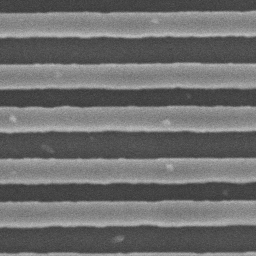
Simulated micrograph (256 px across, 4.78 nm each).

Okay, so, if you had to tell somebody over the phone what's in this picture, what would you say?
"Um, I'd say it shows lines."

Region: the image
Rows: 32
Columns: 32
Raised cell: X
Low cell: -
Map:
--------------------------------
-------------------------------X
XXXXXXXXXXXXXXXXXXXXXXXXXXXXXXXX
XXXXXXXXXXXXXXXXXXXXXXXXXXXXXXXX
X-X----X--XX--XXXX--------------
--------------------------------
--------------------------------
--------------------------------
XXXXXXXXXXXXXXXXXXXXXXXXXXXXXXXX
XXXXXXXXXXXXXXXXXXXXXXXXXXXXXXXX
XXXXXXXXXXXXXXXXXXXXXXXXXXXXXXXX
--------------------------------
--------------------------------
XXXXXX-XXXXXXXXXXXXXXXXXXXXXXXXX
XXXXXXXXXXXXXXXXXXXXXXXXXXXXXXXX
XXXXXXXXXXXXXXXXXXXXXXXXXXXXXXXX
XX------------------------------
--------------------------------
--------------------------------
--------------------------------
XXXXXXXXXXXXXXXXXXXXXXXXXXXXXXXX
XXXXXXXXXXXXXXXXXXXXXXXXXXXXXXXX
XXXXXXXXXXXXXXXXXXXXXXXXXXXXXXXX
--------------------------------
--------------------------------
XXXXXXXXXXXXXXXXXXXXXXXXXXXXXXXX
XXXXXXXXXXXXXXXXXXXXXXXXXXXXXXXX
XXXXXXXXXXXXXXXXXXXXXXXXXXXXXXXX
--------------------------------
--------------------------------
--------------------------------
--------------------------------